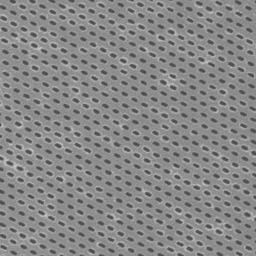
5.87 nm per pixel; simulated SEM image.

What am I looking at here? a regular array of holes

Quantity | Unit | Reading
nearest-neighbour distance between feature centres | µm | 0.0634